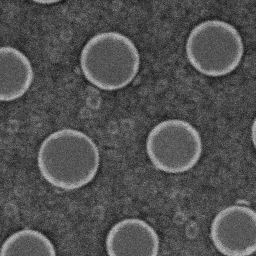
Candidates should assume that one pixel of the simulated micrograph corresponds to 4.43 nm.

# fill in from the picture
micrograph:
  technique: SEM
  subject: raised bodies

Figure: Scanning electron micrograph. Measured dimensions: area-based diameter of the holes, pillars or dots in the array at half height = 243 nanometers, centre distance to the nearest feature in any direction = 469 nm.